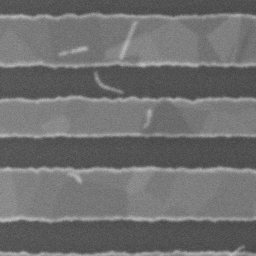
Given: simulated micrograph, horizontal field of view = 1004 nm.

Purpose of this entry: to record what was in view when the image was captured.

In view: lines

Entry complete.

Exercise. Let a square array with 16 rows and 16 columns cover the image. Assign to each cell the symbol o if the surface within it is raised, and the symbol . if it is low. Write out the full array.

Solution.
................
oooooooooooooooo
oooooooooooooooo
oooooooooooooooo
................
................
oooooooooooooooo
oooooooooooooooo
ooo.ooo...oooooo
................
.........o......
oooooooooooooooo
oooooooooooooooo
oooooooooooooooo
................
................